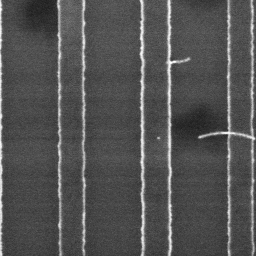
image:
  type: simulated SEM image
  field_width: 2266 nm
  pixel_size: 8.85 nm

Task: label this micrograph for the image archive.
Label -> lines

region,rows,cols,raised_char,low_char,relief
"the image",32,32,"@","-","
-------@@@@-------@@@--------@@@
-------@@@@-------@@@--------@@@
-------@@@@-------@@@--------@@@
-------@@@@-------@@@--------@@@
-------@@@@-------@@@--------@@@
-------@@@@-------@@@--------@@@
-------@@@--------@@@--------@@@
-------@@@@-------@@@--------@@@
-------@@@@-------@@@--------@@@
-------@@@@-------@@@-------@@@@
-------@@@--------@@@--------@@@
-------@@@@-------@@@--------@@@
-------@@@@-------@@@--------@@@
-------@@@@-------@@@--------@@@
-------@@@@-------@@@--------@@@
-------@@@@-------@@@--------@@-
-------@@@@-------@@@-------@@@@
--------@@@-------@@@--------@@@
-------@@@--------@@@--------@@@
-------@@@@-------@@@--------@@@
-------@@@@-------@@@--------@@@
-------@@@@-------@@@--------@@@
-------@@@@-------@@@--------@@@
-------@@@@-------@@@--------@@@
-------@@@@-------@@@--------@@@
--------@@@-------@@@--------@@@
--------@@@-------@@@--------@@@
--------@@@-------@@@--------@@@
-------@@@@-------@@@--------@@@
--------@@@-------@@@--------@@@
-------@@@@-------@@@--------@@@
--------@@@-------@@@--------@@@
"